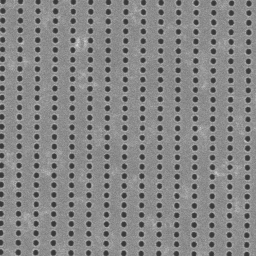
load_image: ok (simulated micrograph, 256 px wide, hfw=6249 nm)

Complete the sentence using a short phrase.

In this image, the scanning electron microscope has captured a regular array of holes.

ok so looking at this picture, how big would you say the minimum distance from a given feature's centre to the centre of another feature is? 230 nm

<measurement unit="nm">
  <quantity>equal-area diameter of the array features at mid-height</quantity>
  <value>143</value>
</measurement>